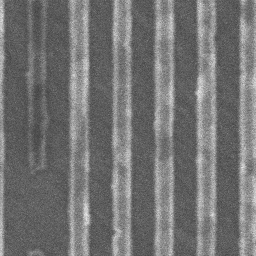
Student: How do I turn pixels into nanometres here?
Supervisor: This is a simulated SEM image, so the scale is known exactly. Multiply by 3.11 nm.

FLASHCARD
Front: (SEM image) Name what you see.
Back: parallel lines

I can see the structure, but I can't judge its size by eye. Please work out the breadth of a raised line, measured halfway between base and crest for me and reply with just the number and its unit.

15.3 px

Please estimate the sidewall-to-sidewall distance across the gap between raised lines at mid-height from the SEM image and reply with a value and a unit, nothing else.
84.2 nm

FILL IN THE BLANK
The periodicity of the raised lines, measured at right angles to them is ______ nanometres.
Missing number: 132